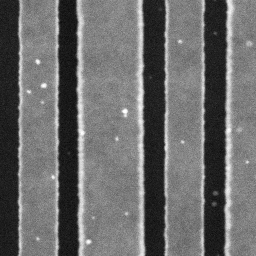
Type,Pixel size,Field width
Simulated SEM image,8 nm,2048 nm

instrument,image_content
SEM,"lines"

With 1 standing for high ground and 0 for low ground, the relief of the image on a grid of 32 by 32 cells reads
00111110001111111100011110001111
00011110001111111100011110001111
00111110001111111100011110001111
00111110001111111100011110001111
00111110001111111100011110001111
00011110001111111100011110001111
00111110001111111100011110001111
00111110001111111100011110001111
00111110001111111100011110001111
00111110001111111100011110001111
00111110001111111100011110001111
00111110001111111100011110001111
00011110001111111100011110001111
00111110001111111100011110001111
00111110001111111100011110001111
00111110001111111100011110001111
00111110001111111100011110001111
00111110001111111100011110001111
00111110001111111100011110001111
00111110001111111100011110001111
00111110001111111100011110001111
00111110001111111100011110001111
00111110001111111100011110001111
00111110001111111100011110001111
00111110001111111100011110001111
00111110001111111100011110001111
00111110001111111100011110001111
00111110001111111100011110001111
00111110001111111100011110001111
00111110001111111100011110001111
00111110001111111100011110001111
00111110001111111100011110001111